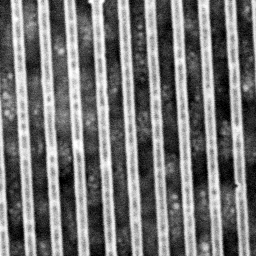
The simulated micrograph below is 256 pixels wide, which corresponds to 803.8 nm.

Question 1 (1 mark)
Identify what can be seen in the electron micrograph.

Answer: parallel lines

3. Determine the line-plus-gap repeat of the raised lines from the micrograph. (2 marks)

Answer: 83.8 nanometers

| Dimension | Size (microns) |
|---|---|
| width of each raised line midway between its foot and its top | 0.0298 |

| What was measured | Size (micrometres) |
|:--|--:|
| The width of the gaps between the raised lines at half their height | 0.0541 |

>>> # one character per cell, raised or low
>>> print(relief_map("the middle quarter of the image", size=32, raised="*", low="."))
.**.....**.....**....***....**..
.**.....**.....**....***....**..
.**.....**.....**....***....**..
.***....**.....**.....**....**..
..**....**.....**.....**....**..
.***....**.....**.....**....**..
..**....**.....**.....**....**..
..**....**.....**.....**....**..
..**....***....**.....**.....*..
..**....***....**.....**.....**.
..**....***....**.....**.....**.
..**.....**....**.....**.....**.
..**.....**....**.....**.....**.
..**.....**....***....**.....**.
..**.....**....***....**.....**.
..**.....**....***....**.....**.
..**.....**.....**....**.....**.
..**.....**.....**....**.....**.
..**.....**.....**....***....**.
..**.....**.....**....***....**.
..***....**.....**....***....**.
..***....**.....**.....**....**.
..***....**.....**.....**....**.
...**....**.....**.....**....***
...**....**.....**.....**....***
...**....***....**.....**....**.
...**....***....**.....**....**.
...**....***....**.....**.....**
...**....***....**.....**.....**
...**.....**....**.....**.....**
...**.....**....***....**.....**
...**.....**....***....**.....**